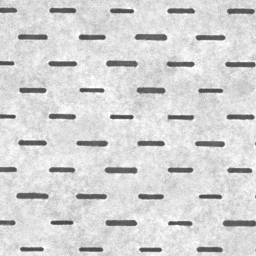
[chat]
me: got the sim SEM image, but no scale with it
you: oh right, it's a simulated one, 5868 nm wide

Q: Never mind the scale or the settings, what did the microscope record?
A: a regular array of holes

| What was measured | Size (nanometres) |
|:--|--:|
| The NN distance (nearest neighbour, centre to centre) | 903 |